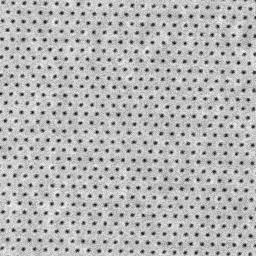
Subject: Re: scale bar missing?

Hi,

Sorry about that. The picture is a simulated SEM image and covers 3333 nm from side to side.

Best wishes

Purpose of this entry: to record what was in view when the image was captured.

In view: a regular array of holes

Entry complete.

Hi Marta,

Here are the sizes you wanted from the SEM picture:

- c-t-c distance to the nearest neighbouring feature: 132 nanometres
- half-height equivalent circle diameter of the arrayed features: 55 nanometres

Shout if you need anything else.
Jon